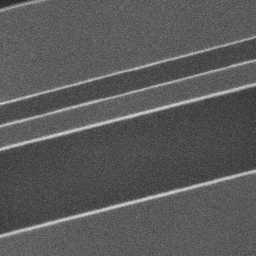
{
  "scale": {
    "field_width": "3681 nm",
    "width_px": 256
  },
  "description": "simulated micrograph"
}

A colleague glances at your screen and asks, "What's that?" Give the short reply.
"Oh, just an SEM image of lines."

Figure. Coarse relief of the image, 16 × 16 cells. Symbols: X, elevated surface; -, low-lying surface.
-XXXXXXXXXXXXXXX
XXXXXXXXXXXXXXXX
XXXXXXXXXXXXXXXX
XXXXXXXXXXXXXXXX
XXXXXXXXXXXXXXXX
XXXXXXXXXXXXXXX-
XXXXXXXXXXX-----
XXXXXXX---------
XXX-------------
----------------
----------------
-------------XXX
---------XXXXXXX
-----XXXXXXXXXXX
-XXXXXXXXXXXXXXX
XXXXXXXXXXXXXXXX